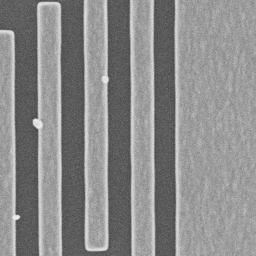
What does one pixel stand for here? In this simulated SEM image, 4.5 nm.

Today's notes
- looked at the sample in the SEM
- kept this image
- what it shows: groups of lines, slits or small figures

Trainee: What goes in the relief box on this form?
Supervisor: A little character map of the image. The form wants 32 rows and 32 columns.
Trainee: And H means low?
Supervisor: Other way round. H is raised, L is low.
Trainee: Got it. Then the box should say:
LLLLLHHLLLLHHLLLHHHLLLHHHHHHHHHH
LLLLLHHHLLLHHLLLHHHLLLHHHHHHHHHH
LLLLLHHHLLLHHLLLHHHLLLHHHHHHHHHH
LLLLLHHHLLLHHLLLHHHLLLHHHHHHHHHH
HHLLLHHHLLLHHLLLHHHLLLHHHHHHHHHH
HHLLLHHHLLLHHLLLHHHLLLHHHHHHHHHH
HHLLLHHHLLLHHLLLHHHLLLHHHHHHHHHH
HHLLLHHHLLLHHLLLHHHLLLHHHHHHHHHH
HHLLLHHHLLLHHLLLHHHLLLHHHHHHHHHH
HHLLLHHHLLLHHLLLHHHLLLHHHHHHHHHH
HHLLLHHHLLLHHLLLHHHLLLHHHHHHHHHH
HHLLLHHHLLLHHLLLHHHLLLHHHHHHHHHH
HHLLLHHHLLLHHLLLHHHLLLHHHHHHHHHH
HHLLLHHHLLLHHLLLHHHLLLHHHHHHHHHH
HHLLLHHHLLLHHLLLHHHLLLHHHHHHHHHH
HHLLHHHHLLLHHLLLHHHLLLHHHHHHHHHH
HHLLLHHHLLLHHLLLHHHLLLHHHHHHHHHH
HHLLLHHHLLLHHLLLHHHLLLHHHHHHHHHH
HHLLLHHHLLLHHLLLHHHLLLHHHHHHHHHH
HHLLLHHHLLLHHLLLHHHLLLHHHHHHHHHH
HHLLLHHHLLLHHLLLHHHLLLHHHHHHHHHH
HHLLLHHHLLLHHLLLHHHLLLHHHHHHHHHH
HHLLLHHHLLLHHLLLHHHLLLHHHHHHHHHH
HHLLLHHHLLLHHLLLHHHLLLHHHHHHHHHH
HHLLLHHHLLLHHLLLHHHLLLHHHHHHHHHH
HHLLLHHHLLLHHLLLHHHLLLHHHHHHHHHH
HHLLLHHHLLLHHLLLHHHLLLHHHHHHHHHH
HHLLLHHHLLLHHLLLHHHLLLHHHHHHHHHH
HHLLLHHHLLLHHLLLHHHLLLHHHHHHHHHH
HHLLLHHHLLLHHLLLHHHLLLHHHHHHHHHH
HHLLLHHHLLLHHLLLHHHLLLHHHHHHHHHH
HHLLLHHHLLLLLLLLLHHLLLHHHHHHHHHH